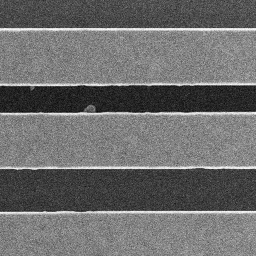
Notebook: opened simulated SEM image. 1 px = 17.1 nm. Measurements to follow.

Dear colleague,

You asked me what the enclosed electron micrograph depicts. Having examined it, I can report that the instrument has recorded lines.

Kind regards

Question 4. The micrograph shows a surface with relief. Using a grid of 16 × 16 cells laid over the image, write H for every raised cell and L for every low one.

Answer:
LLLLLLLLLLLLLLLL
LLLLLLLLLLLLLLLL
HHHHHHHHHHHHHHHH
HHHHHHHHHHHHHHHH
HHHHHHHHHHHHHHHH
LLLLLLLLLLLLLLLL
LLLLLLLLLLLLLLLL
HHHHHHHHHHHHHHHH
HHHHHHHHHHHHHHHH
HHHHHHHHHHHHHHHH
HHHHHHHHHHHHHHHH
LLLLLLLLLLLLLLLL
LLLLLLLLLLLLLLLL
HHHHHHHHHHHHHHHH
HHHHHHHHHHHHHHHH
HHHHHHHHHHHHHHHH